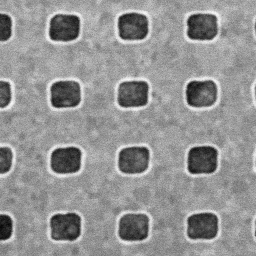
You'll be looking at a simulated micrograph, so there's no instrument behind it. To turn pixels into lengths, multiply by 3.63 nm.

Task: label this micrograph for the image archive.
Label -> a regular array of holes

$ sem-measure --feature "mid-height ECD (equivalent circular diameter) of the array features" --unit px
33.6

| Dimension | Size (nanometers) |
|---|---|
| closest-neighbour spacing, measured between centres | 241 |